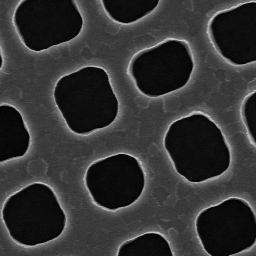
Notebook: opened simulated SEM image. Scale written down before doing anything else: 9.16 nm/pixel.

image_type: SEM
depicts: holes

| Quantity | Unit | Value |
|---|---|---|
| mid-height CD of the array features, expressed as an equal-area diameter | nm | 553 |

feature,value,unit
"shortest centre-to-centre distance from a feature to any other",790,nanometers